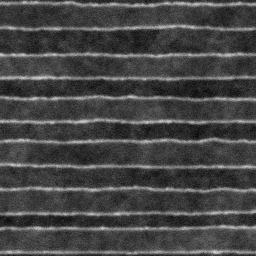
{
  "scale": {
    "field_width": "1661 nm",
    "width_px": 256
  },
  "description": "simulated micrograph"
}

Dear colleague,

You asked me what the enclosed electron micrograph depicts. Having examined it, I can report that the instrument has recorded lines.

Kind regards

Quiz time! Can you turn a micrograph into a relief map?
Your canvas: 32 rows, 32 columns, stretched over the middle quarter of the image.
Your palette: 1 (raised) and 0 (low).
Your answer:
11111111111111111111111111111111
11111111111111111111111111111111
11111111111111111111111111111111
01111111111111111111111111111111
00000000000000000000000000000000
00000000000000000000000000000000
00000000000000000000000000000000
00000000000000000000000000000000
00000111111100111110000110100000
11111111111111111111111111111111
11111111111111111111111111111111
11111111111111111111111111111111
11111111111111111111111111111111
11111111111111111111111111111111
00110000000000001111111000000001
00000000000000000000000000000000
00000000000000000000000000000000
00000000000000000000000000000000
00000000000000000000000000000000
01111111111111111111111111111111
11111111111111111111111111111111
11111111111111111111111111111111
11111111111111111111111111111111
11111111111111111111111111111111
11111111111111111111111111111111
11111111111111111111111111111111
00000000000000000000000000000000
00000000000000000000000000000000
00000000000000000000000000000000
00000000000000000000000000000000
00000000000000000000000000000000
11111111111111111111111111111011